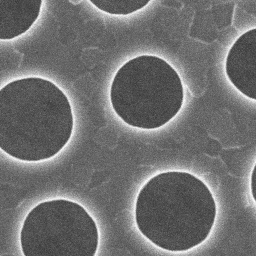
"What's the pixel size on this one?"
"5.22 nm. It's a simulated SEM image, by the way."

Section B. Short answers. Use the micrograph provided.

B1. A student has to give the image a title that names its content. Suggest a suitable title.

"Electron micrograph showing holes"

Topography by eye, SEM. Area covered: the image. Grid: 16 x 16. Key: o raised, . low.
...ooo...ooooooo
..oooooooooooooo
ooooooooooooooo.
oooooooooooooo..
ooooooo....ooo..
....ooo....oooo.
....ooo....ooooo
.....ooo...ooooo
....oooooooooooo
....oooooooooooo
oooooooooooooooo
ooooooooo....ooo
ooo.ooooo....ooo
oo....oo.....ooo
o.....ooo....ooo
o.....oooo..oooo